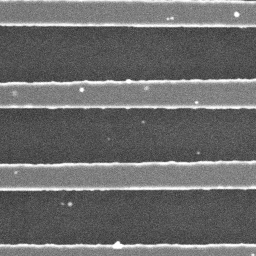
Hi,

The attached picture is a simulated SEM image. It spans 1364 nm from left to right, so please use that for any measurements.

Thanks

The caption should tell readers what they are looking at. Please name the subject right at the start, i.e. lines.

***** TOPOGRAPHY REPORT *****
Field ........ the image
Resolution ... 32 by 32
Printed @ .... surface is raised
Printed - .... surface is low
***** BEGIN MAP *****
@@@@@@@@@@@@@@@@@@@@@@@@@@@@@@@@
@@@@@@@@@@@@@@@@@@@@@@@@@@@@@@@@
@@@@@@@@@@@@@@@@@@@@@@@@@@@@@@@@
--------------------------------
--------------------------------
--------------------------------
--------------------------------
--------------------------------
--------------------------------
--------------------------------
@@@@@@@@@@@@@@@@@@@@@@@@@@@@@@@@
@@@@@@@@@@@@@@@@@@@@@@@@@@@@@@@@
@@@@@@@@@@@@@@@@@@@@@@@@@@@@@@@@
------@--------@@---@@----@@@@--
--------------------------------
--------------------------------
--------------------------------
--------------------------------
--------------------------------
--------------------------------
--------@@@@@@@@@@@@@@@@@@@@@@@@
@@@@@@@@@@@@@@@@@@@@@@@@@@@@@@@@
@@@@@@@@@@@@@@@@@@@@@@@@@@@@@@@@
@@@@@@@@@@@@@@@@@@@@@@@@@@@@@@@@
--------------------------------
--------------------------------
--------------------------------
--------------------------------
--------------------------------
--------------------------------
--------------@-----------------
@@@@@@@@@@@@@@@@@@@@@@@@@@@@@@@@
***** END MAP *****